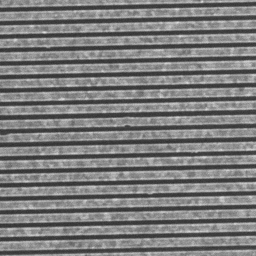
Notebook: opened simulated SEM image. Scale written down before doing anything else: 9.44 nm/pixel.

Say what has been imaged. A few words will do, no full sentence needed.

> parallel lines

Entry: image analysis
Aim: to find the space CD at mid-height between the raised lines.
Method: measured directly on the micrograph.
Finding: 55.5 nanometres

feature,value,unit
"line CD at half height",70.8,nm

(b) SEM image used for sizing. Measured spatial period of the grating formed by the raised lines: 128 nm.